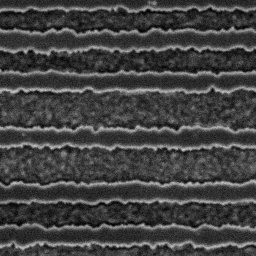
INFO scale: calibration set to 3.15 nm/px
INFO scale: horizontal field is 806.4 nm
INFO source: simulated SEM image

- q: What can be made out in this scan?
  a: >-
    lines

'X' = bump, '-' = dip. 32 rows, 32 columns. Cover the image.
XXXXXXXXXXXXXXXXXXXXXXXXXXXXXXXX
----------------X---------------
--------------------------------
--------------------------------
XXXXXXXXXXXXXXXXXXXXXXXXXXXXXXXX
XXXXXXXXXXXXXXXXXXXXXXXXXXXXXXXX
-X---X-XX------X----------------
--------------------------------
--------------------------------
XXXXXXXXXXXXXXXXXXXXXXXXXXXXXXXX
XXXXXXXXXXXXXXXXXXXXXXXXXXXXXXXX
------------X-------X--XXX--X---
--------------------------------
--------------------------------
--------------------------------
--------------------------------
XXXXXXXXXXXXXXXXXXXXXXXXXXXXXXXX
XXXXXXXXXXXXXXXXXXXXXXXXXXXXXXXX
------X---X--X-XXX-X-XXXXX--X-XX
--------------------------------
--------------------------------
--------------------------------
--------------------------------
XXXXXXXXXXXXXXXXXXXXXXXXXXXXXXXX
XXXXXXXXXXXXXXXXXXXXXXXXXXXXXXXX
-----------X--------------------
--------------------------------
--------------------------------
XXXXXXXXXXXXXXXXXXXXXXXXXXXXXXXX
XXXXXXXXXXXXXXXXXXXXXXXXXXXXXXXX
XXXXXXXXXXXXXXXXXXXXXXX-XXXXXXXX
--------------------------------